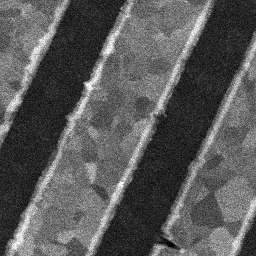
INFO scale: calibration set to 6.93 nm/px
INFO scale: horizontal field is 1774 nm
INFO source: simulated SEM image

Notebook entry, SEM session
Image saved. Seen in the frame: one or a few lines or trenches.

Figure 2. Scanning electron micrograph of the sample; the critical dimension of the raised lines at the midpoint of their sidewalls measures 484 nm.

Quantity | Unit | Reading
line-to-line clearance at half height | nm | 421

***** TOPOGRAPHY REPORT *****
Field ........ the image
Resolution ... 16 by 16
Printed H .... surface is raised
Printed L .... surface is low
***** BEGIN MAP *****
HHHHLLLLHHHHHLLL
HHHLLLLLHHHHLLLL
HHHLLLLHHHHHLLLL
HHLLLLLHHHHLLLLL
HHLLLLHHHHHLLLLH
HLLLLLHHHHHLLLLH
HLLLLHHHHHLLLLHH
LLLLLHHHHHLLLLHH
LLLLHHHHHLLLLHHH
LLLLHHHHHLLLLHHH
LLLHHHHHLLLLHHHH
LLLHHHHHLLLLHHHH
LLHHHHHLLLLHHHHH
LLHHHHHLLLLHHHHH
LHHHHHLLLLLHHHHL
LHHHHHLLLLHHHHHL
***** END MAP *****